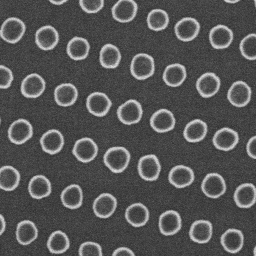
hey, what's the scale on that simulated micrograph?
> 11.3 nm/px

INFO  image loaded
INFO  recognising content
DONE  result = a regular array of raised bodies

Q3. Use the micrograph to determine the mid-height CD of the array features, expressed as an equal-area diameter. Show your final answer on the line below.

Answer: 253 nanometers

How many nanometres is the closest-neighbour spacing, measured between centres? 373